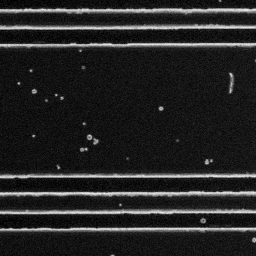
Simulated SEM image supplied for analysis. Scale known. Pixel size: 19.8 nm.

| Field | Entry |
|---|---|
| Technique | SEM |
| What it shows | lines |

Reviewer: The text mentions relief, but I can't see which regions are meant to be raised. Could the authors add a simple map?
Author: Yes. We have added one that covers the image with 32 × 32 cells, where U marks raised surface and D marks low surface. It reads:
DDDDDDDDDDDDDDDDDDDDDDDDDDDDDDDD
UUUUUUUUUUUUUUUUUUUUUUUUUUUUUUUU
UUUUUUUUUUUUUUUUUUUUUUUUUUUUUUUU
DDDDDDDDDDDDDDDDDDDDDDDDDDDDDDDD
DDDDDDDDDDDDDDDDDDDDDDDDDDDDDDDD
DDDDDDDDDDDDDDDDDDDDDDDDDDDDUUUU
UUUUUUUUUUUUUUUUUUUUUUUUUUUUUUUU
UUUUUUUUUUUUUUUUUUUUUUUUUUUUUUUU
UUUUUUUUUUUUUUUUUUUUUUUUUUUUUUUU
UUUUUUUUUUUUUUUUUUUUUUUUUUUUUUUU
UUUUUUUUUUUUUUUUUUUUUUUUUUUUUUUU
UUUUUUUUUUUUUUUUUUUUUUUUUUUUUUUU
UUUUUUUUUUUUUUUUUUUUUUUUUUUUUUUU
UUUUUUUUUUUUUUUUUUUUUUUUUUUUUUUU
UUUUUUUUUUUUUUUUUUUUUUUUUUUUUUUU
UUUUUUUUUUUUUUUUUUUUUUUUUUUUUUUU
UUUUUUUUUUUUUUUUUUUUUUUUUUUUUUUU
UUUUUUUUUUUUUUUUUUUUUUUUUUUUUUUU
UUUUUUUUUUUUUUUUUUUUUUUUUUUUUUUU
UUUUUUUUUUUUUUUUUUUUUUUUUUUUUUUU
UUUUUUUUUUUUUUUUUUUUUUUUUUUUUUUU
UUUUUUUUUUUUUUUUUUUUUUUUUUUUUUUU
DDDDDDDDDDDDDDDDDDDDDDDDDDDDDDDD
DDDDDDDDDDDDDDDDDDDDDDDDDDDDDDDD
UUUUUUUUUUUUUUUUUUUUUUUUUUUUUUUU
UUUUUUUUUUUUUUUUUUUUUUUUUUUUUUUU
UUUUUUUUUUUUUUUUUUUDUUDDDUDDUDDD
DDDDDDDDDDDDDDDDDDDDDDDDDDDDDDDD
DDDDDDDDDDDDDDDDDDDDDDDDDDDDDDDD
UUUUUUUUUUUUUUUUUUUUUUUUUUUUUUUU
UUUUUUUUUUUUUUUUUUUUUUUUUUUUUUUU
UUUUUUUUUUUUUUUUUUUUUUUUUUUUUUUU